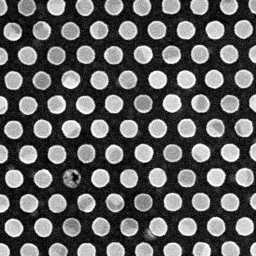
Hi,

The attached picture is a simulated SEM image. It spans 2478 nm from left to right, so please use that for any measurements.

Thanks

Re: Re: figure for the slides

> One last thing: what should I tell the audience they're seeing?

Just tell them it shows a regular array of raised bodies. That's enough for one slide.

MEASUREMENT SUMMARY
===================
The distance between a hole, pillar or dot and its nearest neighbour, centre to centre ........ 0.271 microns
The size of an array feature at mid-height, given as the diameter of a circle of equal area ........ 0.17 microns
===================